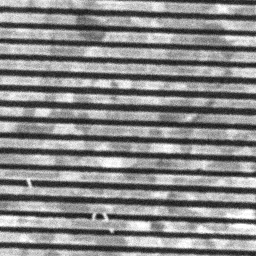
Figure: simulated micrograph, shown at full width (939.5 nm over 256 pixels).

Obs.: parallel lines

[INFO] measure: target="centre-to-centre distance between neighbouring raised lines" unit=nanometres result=57.5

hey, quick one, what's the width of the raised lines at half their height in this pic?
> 31.2 nm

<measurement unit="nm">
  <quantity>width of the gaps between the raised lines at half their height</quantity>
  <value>27.5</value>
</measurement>